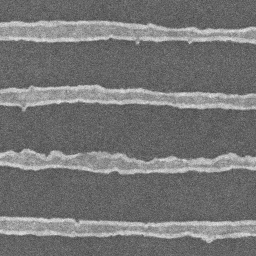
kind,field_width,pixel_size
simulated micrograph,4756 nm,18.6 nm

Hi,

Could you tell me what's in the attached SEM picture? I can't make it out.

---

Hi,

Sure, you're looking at one or a few lines or trenches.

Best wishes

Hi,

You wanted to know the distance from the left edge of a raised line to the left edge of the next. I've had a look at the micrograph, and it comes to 1210 nanometres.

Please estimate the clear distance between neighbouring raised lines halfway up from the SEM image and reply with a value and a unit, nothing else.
53.5 pixels